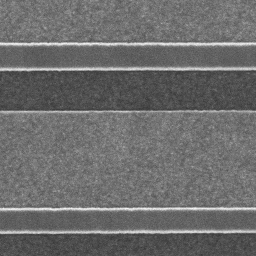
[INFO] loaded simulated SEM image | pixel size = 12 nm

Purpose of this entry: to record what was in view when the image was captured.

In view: lines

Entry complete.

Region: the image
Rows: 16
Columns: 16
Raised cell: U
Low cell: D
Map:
UUUUUUUUUUUUUUUU
UUUUUUUUUUUUUUUU
UUUUUUUUUUUUUUUU
UUUUUUUUUUUUUUUU
DDDDDDDDDDDDDDDD
DDDDDDDDDDDDDDDD
DDDDDDDDDDDDDDDD
UUUUUUUUUUUUUUUU
UUUUUUUUUUUUUUUU
UUUUUUUUUUUUUUUU
UUUUUUUUUUUUUUUU
UUUUUUUUUUUUUUUU
UUUUUUUUUUUUUUUU
UUUUUUUUUUUUUUUU
UUUUUUUUUUUUUUUU
DDDDDDDDDDDDDDDD